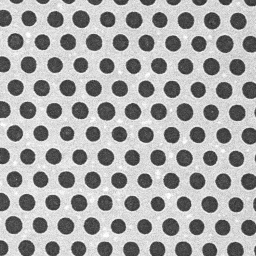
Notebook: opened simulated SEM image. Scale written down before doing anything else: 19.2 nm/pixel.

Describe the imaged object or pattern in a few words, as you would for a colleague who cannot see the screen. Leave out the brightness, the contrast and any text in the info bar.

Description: a regular array of holes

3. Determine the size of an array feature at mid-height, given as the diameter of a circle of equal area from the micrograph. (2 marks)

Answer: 321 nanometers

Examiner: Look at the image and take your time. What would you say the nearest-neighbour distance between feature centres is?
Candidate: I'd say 496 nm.